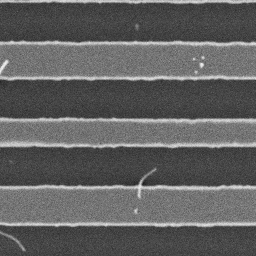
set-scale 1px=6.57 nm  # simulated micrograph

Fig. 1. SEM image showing lines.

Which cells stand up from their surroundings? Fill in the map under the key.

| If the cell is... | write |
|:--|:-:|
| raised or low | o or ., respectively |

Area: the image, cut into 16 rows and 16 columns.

................
................
................
oooooooooooooooo
oooooooooooooooo
................
................
oooooooooooooooo
oooooooooooooooo
................
................
................
oooooooooooooooo
oooooooooooooooo
................
................